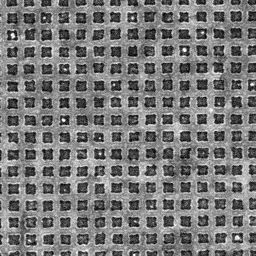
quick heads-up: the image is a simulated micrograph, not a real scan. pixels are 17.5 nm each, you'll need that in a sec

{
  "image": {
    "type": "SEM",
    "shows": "a regular array of holes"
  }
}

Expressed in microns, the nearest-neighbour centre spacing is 0.293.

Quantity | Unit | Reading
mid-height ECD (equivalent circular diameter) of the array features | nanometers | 218